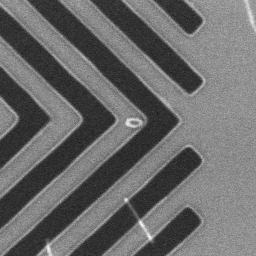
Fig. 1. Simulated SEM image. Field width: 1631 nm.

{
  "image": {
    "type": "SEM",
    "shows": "groups of lines, slits or small figures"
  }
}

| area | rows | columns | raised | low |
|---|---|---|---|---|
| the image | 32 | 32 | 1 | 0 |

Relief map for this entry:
00001111000111110001111100000000
10000111100011111000111110000000
11000011110001111100011110000000
11100001111000111110001110000000
11110000111100001111000000000000
01111000011110000111100000000000
00111100001111000011110000000000
00011110000111100001111000000000
10001111000011110000111100000000
10000111100001111000011110000000
11100011110000111100001110000000
11110001111100011110000100000000
11111000111110001111000000000000
01111000011111000111100000000000
00111100001111000011110000000000
00111100001111001111110000000000
01111000011110000111110000000000
11110000111100001111000000000000
11100001111000011110000100000000
11000011110000111100001110000000
10001111100001111000011110000000
00011111000111110000111100000000
00111110001111100001111000000000
01111100011111000011110000000000
11111000111110001111100000000000
11110001111100011111000000000000
11100011111000111110001110000000
11000111110001111100011110000000
00001111100011111000111110000000
00011110000111110001111100000000
00111100001111100011111000000000
01111000011111000111110000000000